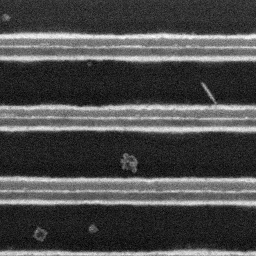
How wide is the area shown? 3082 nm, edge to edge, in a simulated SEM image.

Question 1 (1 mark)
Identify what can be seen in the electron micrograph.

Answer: lines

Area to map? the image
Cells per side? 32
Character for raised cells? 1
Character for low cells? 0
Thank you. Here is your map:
00000000000000000000000000000000
00000000000000000000000000000000
00000000000000000000000000000000
00000000000000000000000000000000
00000000000000000000000000000000
11111111111111111111111111111111
11111111111111111111111111111111
00000000000000000000000000000000
00000000000000000000000000000000
00000000000000000000000000000000
00000000000000000000000000000000
00000000000000000000000000000000
00000000000000000000000000000000
00000000000000000000000000000000
11111111111111111111111111111111
11111111111111111111111111111111
00000000000000000000000000000000
00000000000000000000000000000000
00000000000000000000000000000000
00000000000000000000000000000000
00000000000000000000000000000000
00000000000000000000000000000000
00000000000000000000000000000000
11111111111111111111111111111111
11111111111111111111111111111111
00000000000000000000000000000000
00000000000000000000000000000000
00000000000000000000000000000000
00000000000000000000000000000000
00000000000000000000000000000000
00000000000000000000000000000000
00000000000000000000000000000000